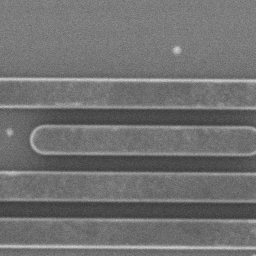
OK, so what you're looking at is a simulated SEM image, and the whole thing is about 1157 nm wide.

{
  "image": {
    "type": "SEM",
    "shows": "groups of lines, slits or small figures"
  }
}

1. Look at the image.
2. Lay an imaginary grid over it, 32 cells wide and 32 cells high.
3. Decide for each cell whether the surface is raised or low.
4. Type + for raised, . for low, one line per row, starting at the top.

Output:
................................
................................
................................
................................
................................
................................
................................
................................
................................
................................
++++++++++++++++++++++++++++++++
++++++++++++++++++++++++++++++++
++++++++++++++++++++++++++++++++
......................++++++++++
................................
................................
....++++++++++++++++++++++++++++
....++++++++++++++++++++++++++++
....++++++++++++++++++++++++++++
................................
................................
................................
++++++++++++++++++++++++++++++++
++++++++++++++++++++++++++++++++
++++++++++++++++++++++++++++++++
................................
................................
+++++++++++++++++++++++++++++...
++++++++++++++++++++++++++++++++
++++++++++++++++++++++++++++++++
++++++++++++++++++++++++++++++++
................................